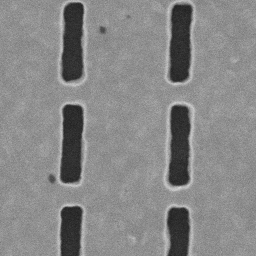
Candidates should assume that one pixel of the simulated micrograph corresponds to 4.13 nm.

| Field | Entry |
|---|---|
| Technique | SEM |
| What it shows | holes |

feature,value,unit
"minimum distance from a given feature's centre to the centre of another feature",421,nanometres